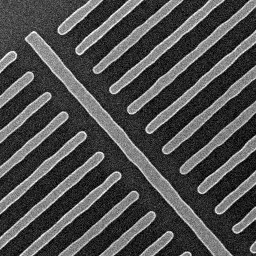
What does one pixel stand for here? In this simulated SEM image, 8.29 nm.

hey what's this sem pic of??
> groups of lines, slits or small figures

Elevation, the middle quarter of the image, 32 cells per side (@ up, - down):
--------@@@-------@@@-------@@@-
@------@@@------@@@@-------@@@--
@@-------------@@@@------@@@@---
@@@-----------@@@@------@@@@----
@@@@---------@@@@------@@@@-----
@@@@@-------@@@-------@@@@------
-@@@@@-----@@@-------@@@-------@
--@@@@@-------------@@@-------@@
---@@@@@-----------@@@-------@@@
----@@@@---------@@@@-------@@@-
-----@@@@-------@@@@-------@@@--
------@@@@------@@@------@@@@---
@-----@@@@@-------------@@@@----
@------@@@@@-----------@@@@-----
--------@@@@@---------@@@-------
---------@@@@@-------@@@------@@
----------@@@@@------@@-------@@
---@@------@@@@-------------@@@@
--@@@-------@@@@-----------@@@@-
-@@@@--------@@@@---------@@@@--
@@@-----------@@@@-------@@@@---
@@-------------@@@@------@@-----
@-------@@-----@@@@@------------
-------@@@------@@@@@-----------
-----@@@@--------@@@@---------@@
----@@@@----------@@@@--------@@
---@@@@------------@@@@------@@@
--@@@-------@@------@@@@--------
-@@@-------@@@-------@@@@-------
@@@-------@@@--------@@@@@------
@@-------@@@----------@@@@@-----
@------@@@@------------@@@@@----